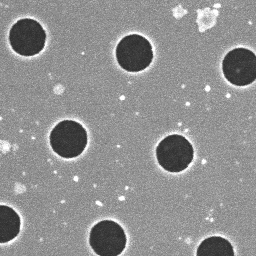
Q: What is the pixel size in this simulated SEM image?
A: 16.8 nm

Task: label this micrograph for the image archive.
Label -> holes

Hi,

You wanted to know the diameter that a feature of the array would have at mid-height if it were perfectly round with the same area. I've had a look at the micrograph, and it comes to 0.641 microns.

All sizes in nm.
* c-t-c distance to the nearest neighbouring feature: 1800